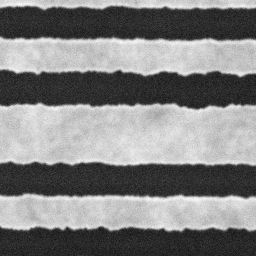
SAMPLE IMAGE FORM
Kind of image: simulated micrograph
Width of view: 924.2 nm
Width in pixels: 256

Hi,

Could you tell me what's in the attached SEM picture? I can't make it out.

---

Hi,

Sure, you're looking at lines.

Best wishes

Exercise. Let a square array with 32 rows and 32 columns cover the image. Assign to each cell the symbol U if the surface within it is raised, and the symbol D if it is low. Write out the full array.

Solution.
UUUUUUUUUUUUUUUUUUUUUUUUUUUUUUUU
DDDDDDDDDDDDDDDDDDDDDDDDDDDDDDDD
DDDDDDDDDDDDDDDDDDDDDDDDDDDDDDDD
DDDDDDDDDDDDDDDDDDDDDDDDDDDDDDDD
DDDDDDDDDDDDDDDDDDDDDDDDDDDDDDDD
UUUUUUUUUUUUUUUUUUUUUUUUUUUUUUUU
UUUUUUUUUUUUUUUUUUUUUUUUUUUUUUUU
UUUUUUUUUUUUUUUUUUUUUUUUUUUUUUUU
UUUUUUUUUUUUUUUUUUUUUUUUUUUUUUUU
DDDDDDDDDDDDDDDDDDDDDDDDDDDDDDDD
DDDDDDDDDDDDDDDDDDDDDDDDDDDDDDDD
DDDDDDDDDDDDDDDDDDDDDDDDDDDDDDDD
DDDDDDDDDDDDDDDDDDDDDDDDDDDDDDDD
UUUUUUUUUUUUUUUUUUUUUUUDDDUUUUUU
UUUUUUUUUUUUUUUUUUUUUUUUUUUUUUUU
UUUUUUUUUUUUUUUUUUUUUUUUUUUUUUUU
UUUUUUUUUUUUUUUUUUUUUUUUUUUUUUUU
UUUUUUUUUUUUUUUUUUUUUUUUUUUUUUUU
UUUUUUUUUUUUUUUUUUUUUUUUUUUUUUUU
UUUUUUUUUUUUUUUUUUUUUUUUUUUUUUUU
DDUDDDUDUDDDDUUUUUDDUUUDUUUUDUUU
DDDDDDDDDDDDDDDDDDDDDDDDDDDDDDDD
DDDDDDDDDDDDDDDDDDDDDDDDDDDDDDDD
DDDDDDDDDDDDDDDDDDDDDDDDDDDDDDDD
UUUUUUDUUUDUUUUUUDDDDDUDDDDDDDDD
UUUUUUUUUUUUUUUUUUUUUUUUUUUUUUUU
UUUUUUUUUUUUUUUUUUUUUUUUUUUUUUUU
UUUUUUUUUUUUUUUUUUUUUUUUUUUUUUUU
DUUUDDUUDUUUDUUDDUUUUUUUUUDUUUUU
DDDDDDDDDDDDDDDDDDDDDDDDDDDDDDDD
DDDDDDDDDDDDDDDDDDDDDDDDDDDDDDDD
DDDDDDDDDDDDDDDDDDDDDDDDDDDDDDDD